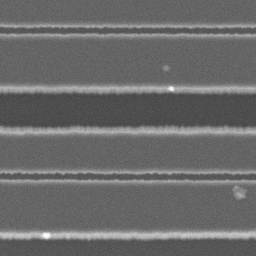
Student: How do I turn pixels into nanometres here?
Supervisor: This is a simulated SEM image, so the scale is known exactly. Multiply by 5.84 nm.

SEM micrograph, lines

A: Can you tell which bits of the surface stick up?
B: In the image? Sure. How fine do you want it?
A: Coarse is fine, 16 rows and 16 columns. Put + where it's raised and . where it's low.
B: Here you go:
++++++++++++++++
++++++++++++++++
++++++++++++++++
++++++++++++++++
++++++++++++++++
++++++++++++++++
................
................
++++++++++++++++
++++++++++++++++
++++++++++++++++
++++++++++++++++
++++++++++++++++
++++++++++++++++
++++++++++++++++
................